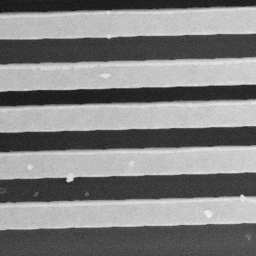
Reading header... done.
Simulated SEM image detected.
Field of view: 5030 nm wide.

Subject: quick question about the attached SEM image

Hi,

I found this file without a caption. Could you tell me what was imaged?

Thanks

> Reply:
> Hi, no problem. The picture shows lines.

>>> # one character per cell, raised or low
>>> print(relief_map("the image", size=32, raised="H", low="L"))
LLLLLLLLLLLLLLLLLLLLLLLLLLLLLLLL
LLLLLLLLLHHHHHHHHHHHHHHHHHHHHHHH
HHHHHHHHHHHHHHHHHHHHHHHHHHHHHHHH
HHHHHHHHHHHHHHHHHHHHHHHHHHHHHHHH
HHHHHHHHHHHHHHHHHLLLLLLLLLLLLLLL
LLLLLLLLLLLLLLLLLLLLLLLLLLLLLLLL
LLLLLLLLLLLLLLLLLLLLLLLLLLLLLLLL
LLLLLLLLLLLLLLLLLLLLLLLLLLLLHHHH
HHHHHHHHHHHHHHHHHHHHHHHHHHHHHHHH
HHHHHHHHHHHHHHHHHHHHHHHHHHHHHHHH
HHHHHHHHHHHHHHHHHHHHHHHHHHHHHHLL
LLLLLLLLLLLLLLLLLLLLLLLLLLLLLLLL
LLLLLLLLLLLLLLLLLLLLLLLLLLLLLLLL
HHHHHHHHHHHHHHHHHHHHHHHHHHHHHHHH
HHHHHHHHHHHHHHHHHHHHHHHHHHHHHHHH
HHHHHHHHHHHHHHHHHHHHHHHHHHHHHHHH
LLLLLLLLLLLLLLLLLLLLLLLLLLLLLLLL
LLLLLLLLLLLLLLLLLLLLLLLLLLLLLLLL
LLLLLLLLLLLLLLLLLLLLLLLLLHHHHHHH
HHHHHHHHHHHHHHHHHHHHHHHHHHHHHHHH
HHHHHHHHHHHHHHHHHHHHHHHHHHHHHHHH
HHHHHHHHHHHHHHHHHHHHHHHHHHHHHHHL
LLLLLLLLHLLLLLLLLLLLLLLLLLLLLLLL
LLLLLLLLLLLLLLLLLLLLLLLLLLLLLLLL
LLLLLLLLLLLLLLLLLLLLLLLLLLLLLLLL
LLHHHHHHHHHHHHHHHHHHHHHHHHHHHHHH
HHHHHHHHHHHHHHHHHHHHHHHHHHHHHHHH
HHHHHHHHHHHHHHHHHHHHHHHHHHHHHHHH
HHHHHLLLLLLLLLLLLLLLLLLLLLLLLLLL
LLLLLLLLLLLLLLLLLLLLLLLLLLLLLLLL
LLLLLLLLLLLLLLLLLLLLLLLLLLLLLLLL
LLLLLLLLLLLLLLLLLLLLLLLLLLLLLLLL